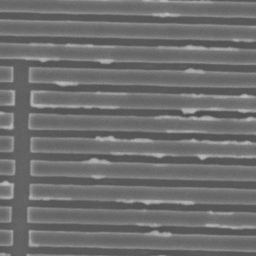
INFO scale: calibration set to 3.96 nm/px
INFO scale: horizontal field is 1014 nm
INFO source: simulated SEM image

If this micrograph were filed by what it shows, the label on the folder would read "parallel lines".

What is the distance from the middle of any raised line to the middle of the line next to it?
92.5 nanometres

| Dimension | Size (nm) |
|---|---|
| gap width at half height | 32.2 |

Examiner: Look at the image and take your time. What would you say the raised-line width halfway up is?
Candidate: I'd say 60.9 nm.